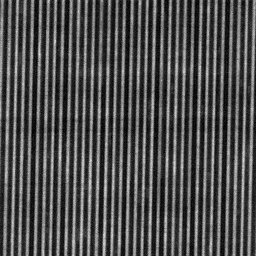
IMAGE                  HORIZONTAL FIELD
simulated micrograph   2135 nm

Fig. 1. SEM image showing parallel lines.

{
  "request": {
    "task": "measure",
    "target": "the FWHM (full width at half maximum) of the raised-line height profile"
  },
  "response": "16.7 nanometres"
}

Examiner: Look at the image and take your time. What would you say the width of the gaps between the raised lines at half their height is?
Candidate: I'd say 41.7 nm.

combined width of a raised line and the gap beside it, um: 0.0637